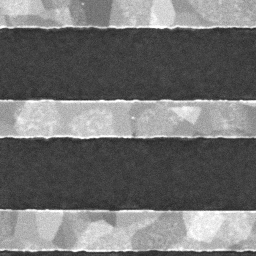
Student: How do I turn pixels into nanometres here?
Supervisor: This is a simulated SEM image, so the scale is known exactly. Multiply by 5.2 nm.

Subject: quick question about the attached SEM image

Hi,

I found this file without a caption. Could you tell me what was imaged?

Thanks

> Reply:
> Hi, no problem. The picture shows lines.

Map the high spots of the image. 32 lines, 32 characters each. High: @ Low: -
@@@@@@@@@@@@@@@@@@@@@@@@@@@@@@@@
@@@@@@@@@@@@@@@@@@@@@@@@@@@@@@@@
@@@@@@@@@@@@@@@@@@@@@@@@@@@@@@@@
-----@---------------@----------
--------------------------------
--------------------------------
--------------------------------
--------------------------------
--------------------------------
--------------------------------
--------------------------------
--------------------------------
--------------------------------
@@@@@@@@@@@@@@@@@@@@@@@@@@@@@@@@
@@@@@@@@@@@@@@@@@@@@@@@@@@@@@@@@
@@@@@@@@@@@@@@@@@@@@@@@@@@@@@@@@
@@@@@@@@@@@@@@@@@@@@@@@@@@@@@@@@
--------------------------------
--------------------------------
--------------------------------
--------------------------------
--------------------------------
--------------------------------
--------------------------------
--------------------------------
--------------------------------
@@@@@@@@@@@@@@@@@@@@@@@@@@@@@@@@
@@@@@@@@@@@@@@@@@@@@@@@@@@@@@@@@
@@@@@@@@@@@@@@@@@@@@@@@@@@@@@@@@
@@@@@@@@@@@@@@@@@@@@@@@@@@@@@@@@
@@@@@@@@@@@@@@@@@@@@@@@@@@@@@@@@
--------------------------------